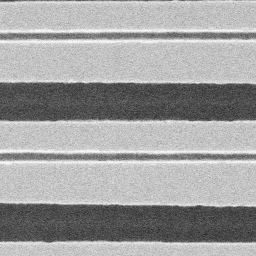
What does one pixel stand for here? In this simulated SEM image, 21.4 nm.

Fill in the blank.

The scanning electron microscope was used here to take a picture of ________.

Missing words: lines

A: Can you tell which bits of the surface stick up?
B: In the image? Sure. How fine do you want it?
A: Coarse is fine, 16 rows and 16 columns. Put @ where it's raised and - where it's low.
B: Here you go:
@@@@@@@@@@@@@@@@
@@@@@@@@@@@@@@@@
@@@@@@@@@@@@@@@@
@@@@@@@@@@@@@@@@
@@@@@@@@@@@@@@@@
----------------
----------------
----------------
@@@@@@@@@@@@@@@@
@@@@@@@@@@@@@@@@
@@@@@@@@@@@@@@@@
@@@@@@@@@@@@@@@@
@@@@@@@@@@@@@@@@
----------------
----------------
@@@@@@@@@@@@@@@@